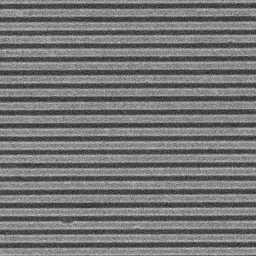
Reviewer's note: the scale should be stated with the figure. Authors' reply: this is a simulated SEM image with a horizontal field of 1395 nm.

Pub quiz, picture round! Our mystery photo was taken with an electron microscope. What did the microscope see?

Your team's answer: parallel lines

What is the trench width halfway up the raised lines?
31.3 nm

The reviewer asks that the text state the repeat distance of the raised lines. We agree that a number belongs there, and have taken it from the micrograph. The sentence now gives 72.3 nanometres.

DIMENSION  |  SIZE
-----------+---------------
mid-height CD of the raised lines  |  41.5 nm